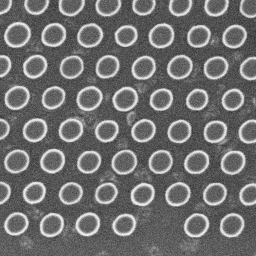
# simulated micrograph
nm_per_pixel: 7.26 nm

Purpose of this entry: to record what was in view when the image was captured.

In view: a regular array of raised bodies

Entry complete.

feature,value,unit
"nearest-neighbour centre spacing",258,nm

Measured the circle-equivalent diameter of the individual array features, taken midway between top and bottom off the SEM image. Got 165 nanometers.